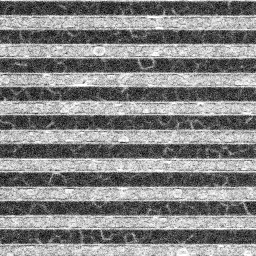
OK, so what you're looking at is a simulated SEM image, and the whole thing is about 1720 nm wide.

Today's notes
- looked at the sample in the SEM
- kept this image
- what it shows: parallel lines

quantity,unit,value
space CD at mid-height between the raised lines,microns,0.0789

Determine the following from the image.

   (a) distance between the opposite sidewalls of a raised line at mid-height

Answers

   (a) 114 nm